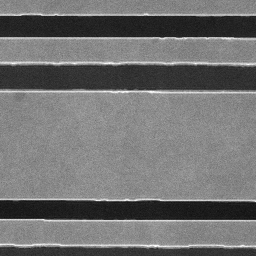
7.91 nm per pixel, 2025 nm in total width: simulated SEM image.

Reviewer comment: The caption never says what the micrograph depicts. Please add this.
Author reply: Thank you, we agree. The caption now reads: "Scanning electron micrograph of lines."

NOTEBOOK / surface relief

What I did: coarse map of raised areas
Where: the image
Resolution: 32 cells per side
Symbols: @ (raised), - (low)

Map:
@@@@@@@@@@@@@@@@@@@@@@@@@@@@@@@@
@@@@@@@@@@@@@@@@@@@@@@@@@@@@@@@@
--------------------------------
--------------------------------
--------------------------------
@@@@@@@@@@@@@@@@@@@@@@@@@@@@@@@@
@@@@@@@@@@@@@@@@@@@@@@@@@@@@@@@@
@@@@@@@@@@@@@@@@@@@@@@@@@@@@@@@@
--------------------------------
--------------------------------
--------------------------------
@@@@@@@@@@@@@@@@@@@@@------@@---
@@@@@@@@@@@@@@@@@@@@@@@@@@@@@@@@
@@@@@@@@@@@@@@@@@@@@@@@@@@@@@@@@
@@@@@@@@@@@@@@@@@@@@@@@@@@@@@@@@
@@@@@@@@@@@@@@@@@@@@@@@@@@@@@@@@
@@@@@@@@@@@@@@@@@@@@@@@@@@@@@@@@
@@@@@@@@@@@@@@@@@@@@@@@@@@@@@@@@
@@@@@@@@@@@@@@@@@@@@@@@@@@@@@@@@
@@@@@@@@@@@@@@@@@@@@@@@@@@@@@@@@
@@@@@@@@@@@@@@@@@@@@@@@@@@@@@@@@
@@@@@@@@@@@@@@@@@@@@@@@@@@@@@@@@
@@@@@@@@@@@@@@@@@@@@@@@@@@@@@@@@
@@@@@@@@@@@@@@@@@@@@@@@@@@@@@@@@
@@@@@@@@@@@@@@@@@@@@@@@@@@@@@@@@
--------------------------------
--------------------------------
@@@@@@--------------------------
@@@@@@@@@@@@@@@@@@@@@@@@@@@@@@@@
@@@@@@@@@@@@@@@@@@@@@@@@@@@@@@@@
@@@@@@@@@@@@@@@@@@@@@@@@@@@@@@@@
--------------------------------